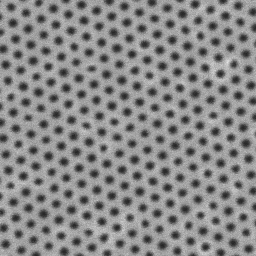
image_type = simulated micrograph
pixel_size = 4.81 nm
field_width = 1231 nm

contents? a regular array of holes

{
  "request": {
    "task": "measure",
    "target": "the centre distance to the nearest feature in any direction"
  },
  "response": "76.4 nm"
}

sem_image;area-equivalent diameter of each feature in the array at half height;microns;0.0406